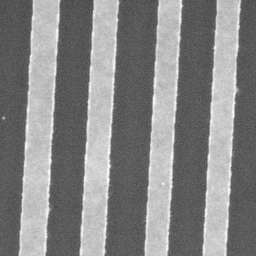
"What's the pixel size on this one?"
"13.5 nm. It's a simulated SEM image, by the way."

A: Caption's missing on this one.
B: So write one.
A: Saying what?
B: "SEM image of lines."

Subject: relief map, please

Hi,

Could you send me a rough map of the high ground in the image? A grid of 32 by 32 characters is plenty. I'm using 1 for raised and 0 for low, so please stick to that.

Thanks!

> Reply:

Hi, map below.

00001110000011100000111000011100
00001110000011100000111000011100
00001110000011100000111000011100
00001110000011100000110000011100
00001110000011000000110000011100
00001110000011000000110000011100
00001110000111000000110000011100
00001110000111000001110000011100
00001110000111000001110000011000
00001110000111000001110000011000
00001110000111000001110000011000
00001110000111000001110000011000
00001110000111000001110000111000
00011110000111000001110000111000
00011110000111000001110000111000
00011110000111000001110000111000
00011110000111000001110000111000
00011100000111000001110000111000
00011100000111000001110000111000
00011100000111000001110000111000
00011100000111000001110000111000
00011100000111000001100000111000
00011100000111000001100000111000
00011100000110000001100000111000
00011100001110000001100000111000
00011100001110000011100000111000
00011100001110000011100000110000
00011100001110000011100000110000
00011100001110000011100000110000
00011100001110000011100000110000
00011100001110000011100001110000
00111100001110000011100001110000